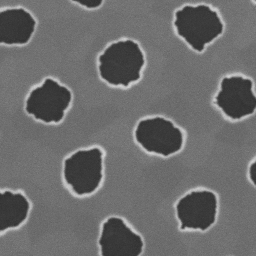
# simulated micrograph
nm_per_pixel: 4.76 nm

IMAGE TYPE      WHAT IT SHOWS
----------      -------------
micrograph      holes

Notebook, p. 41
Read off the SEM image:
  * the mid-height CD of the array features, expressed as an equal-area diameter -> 0.203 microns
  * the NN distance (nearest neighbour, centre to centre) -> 0.391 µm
